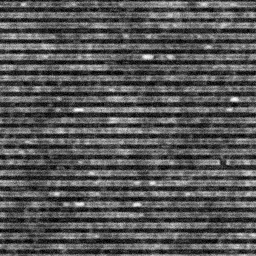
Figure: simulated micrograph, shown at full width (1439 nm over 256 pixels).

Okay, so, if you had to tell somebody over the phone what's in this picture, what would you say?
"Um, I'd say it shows parallel lines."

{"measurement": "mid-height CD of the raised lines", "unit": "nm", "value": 28.8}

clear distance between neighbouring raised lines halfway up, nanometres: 32.3